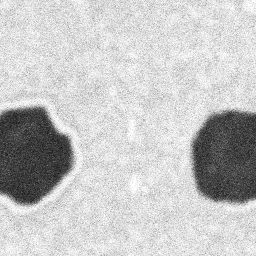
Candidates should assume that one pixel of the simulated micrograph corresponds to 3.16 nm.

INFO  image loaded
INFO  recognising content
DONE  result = holes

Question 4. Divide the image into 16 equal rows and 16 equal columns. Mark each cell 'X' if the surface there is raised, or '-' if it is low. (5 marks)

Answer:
XXXXXXXXXXXXXXXX
XXXXXXXXXXXXXXXX
XXXXXXXXXXXXXXXX
XXXXXXXXXXXXXXXX
XXXXXXXXXXXXXXXX
XXXXXXXXXXXXXXXX
XXXXXXXXXXXXXXXX
---XXXXXXXXXX---
----XXXXXXXX----
-----XXXXXXX----
-----XXXXXXX----
----XXXXXXXX----
X--XXXXXXXXXX---
XXXXXXXXXXXXXXXX
XXXXXXXXXXXXXXXX
XXXXXXXXXXXXXXXX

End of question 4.